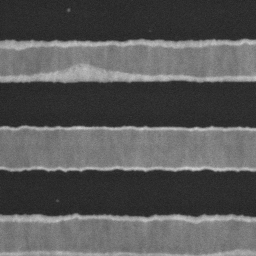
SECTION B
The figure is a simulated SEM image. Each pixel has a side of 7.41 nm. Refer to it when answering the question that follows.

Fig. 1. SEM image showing lines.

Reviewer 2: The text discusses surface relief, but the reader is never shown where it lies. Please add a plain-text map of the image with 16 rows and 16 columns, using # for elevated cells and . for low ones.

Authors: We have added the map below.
................
................
................
################
################
................
................
................
################
################
################
................
................
###.###...##.##.
################
################